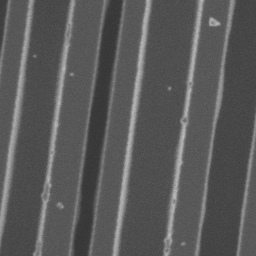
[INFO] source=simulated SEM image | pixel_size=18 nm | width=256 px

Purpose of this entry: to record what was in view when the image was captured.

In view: lines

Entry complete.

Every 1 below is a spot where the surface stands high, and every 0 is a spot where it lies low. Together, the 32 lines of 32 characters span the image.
01110000011110011110000001111000
01110000011110011100000001111000
01110000011110011100000001111000
01100000111110011100000001111000
01100000111110011100000001110000
11100000111100011100000011110000
11100000111100011100000011110000
11100000111100011100000011110000
11100000111100111000000011110000
11100000111100111000000011110000
11100000111100111000000011110000
11000000111100111000000011100000
11000001111000111000000011100000
11000001111000111000000111100000
11000001111000111000000111100000
11000001111001111000000111100000
11000001111001110000000111100000
11000001111001110000000111100000
10000011111001110000000111000000
10000011110001110000001111000001
10000011110001110000001111000001
10000011110001110000001111000001
10000011110011110000001111000001
10000011110011100000001111000001
10000111110011100000001111000001
10000011110011100000001111000001
00000011110011100000001110000011
00000111100011100000011110000011
00000111100011100000011110000011
00000111100011100000011110000011
00000111100111100000011110000011
00001111100111000000011110000011